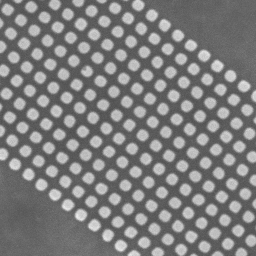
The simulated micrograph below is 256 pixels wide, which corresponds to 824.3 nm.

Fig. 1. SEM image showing a regular array of raised bodies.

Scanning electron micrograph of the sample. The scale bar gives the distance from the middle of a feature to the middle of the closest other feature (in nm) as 53.1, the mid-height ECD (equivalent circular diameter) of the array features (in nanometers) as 35.3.